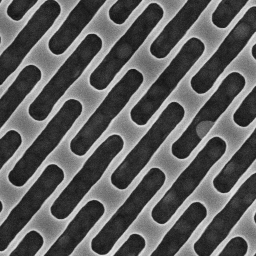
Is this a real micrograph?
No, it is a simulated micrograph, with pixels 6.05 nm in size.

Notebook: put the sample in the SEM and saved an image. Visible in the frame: a regular array of holes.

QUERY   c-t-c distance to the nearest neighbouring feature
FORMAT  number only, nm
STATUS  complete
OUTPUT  325